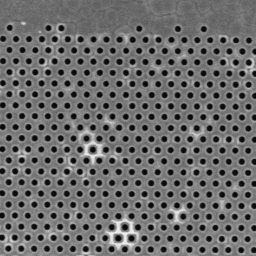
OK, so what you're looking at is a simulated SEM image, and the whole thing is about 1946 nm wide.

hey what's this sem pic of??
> a regular array of holes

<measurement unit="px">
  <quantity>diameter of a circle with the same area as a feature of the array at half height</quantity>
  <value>6.08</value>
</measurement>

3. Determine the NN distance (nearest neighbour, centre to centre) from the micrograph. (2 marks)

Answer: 0.0948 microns